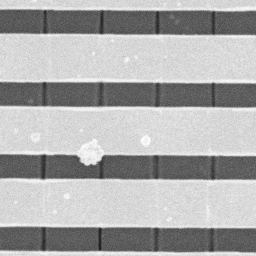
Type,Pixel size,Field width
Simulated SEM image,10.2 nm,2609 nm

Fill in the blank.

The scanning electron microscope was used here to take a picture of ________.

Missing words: wiring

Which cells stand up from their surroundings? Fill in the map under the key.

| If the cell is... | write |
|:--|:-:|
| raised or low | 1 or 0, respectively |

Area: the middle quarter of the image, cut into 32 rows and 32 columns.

11111111111111111111111111111111
11111111111111111111111111111111
11111111111111111111111111111111
11111111111111111111111111111111
00000000000000000000000000000000
00000000000000000000000000000000
00000000000000000000000000000000
00000000000000000000000000000000
00000000000000000000000000000000
00000000000000000000000000000000
00000000000000000000000000000000
11111111011111111111111111111111
11111111111111111111111111111111
11111111111111111111111111111111
11111111111111111111111111111111
11111111111111111111111111111111
11111111111111111111111111111111
11111111111111111111111111111111
11111111111111111111111111111111
11111111111111111111111111111111
11111111111111111111111111111111
11111111111111111111111111111111
00011111110000000000000001111111
00001111100000000000000000000000
00001111000000000000000000000000
00000000000000000000000000000000
00000000000000000000000000000000
00000000000000000000000000000000
00000000000000000000000000000000
11111111111111111111111111111111
11111111111111111111111111111111
11111111111111111111111111111111